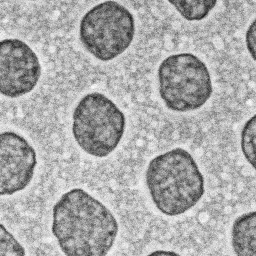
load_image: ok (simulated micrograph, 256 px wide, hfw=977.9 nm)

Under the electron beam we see holes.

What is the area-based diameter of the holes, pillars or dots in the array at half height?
0.22 micrometres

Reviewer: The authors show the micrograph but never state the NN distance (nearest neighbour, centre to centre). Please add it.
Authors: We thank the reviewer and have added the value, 359 nm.